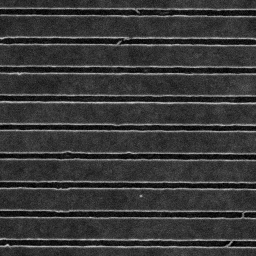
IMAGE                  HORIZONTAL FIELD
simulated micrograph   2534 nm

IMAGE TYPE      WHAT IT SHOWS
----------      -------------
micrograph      parallel lines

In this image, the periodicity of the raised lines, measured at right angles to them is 0.285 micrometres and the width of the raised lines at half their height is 0.228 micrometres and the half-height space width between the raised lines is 58.2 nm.